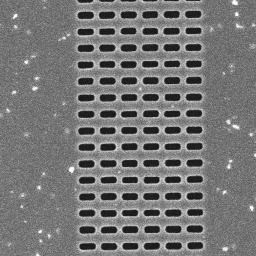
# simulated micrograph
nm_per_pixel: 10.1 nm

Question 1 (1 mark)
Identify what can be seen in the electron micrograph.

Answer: a regular array of holes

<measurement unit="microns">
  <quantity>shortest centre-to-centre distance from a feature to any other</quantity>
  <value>0.166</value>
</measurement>